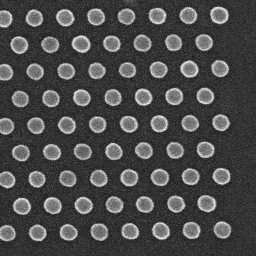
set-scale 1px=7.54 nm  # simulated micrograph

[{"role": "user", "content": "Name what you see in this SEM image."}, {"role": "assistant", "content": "a regular array of raised bodies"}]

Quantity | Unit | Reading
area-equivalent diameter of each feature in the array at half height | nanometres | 121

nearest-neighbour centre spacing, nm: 231